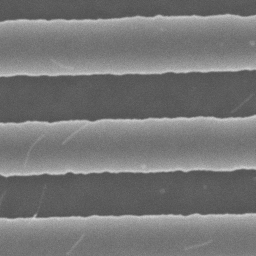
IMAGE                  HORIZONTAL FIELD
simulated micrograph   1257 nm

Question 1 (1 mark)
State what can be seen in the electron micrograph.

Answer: lines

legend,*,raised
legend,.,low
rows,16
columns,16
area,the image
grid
................
****************
****************
****************
************....
................
................
......**********
****************
****************
****************
................
................
......**********
****************
****************